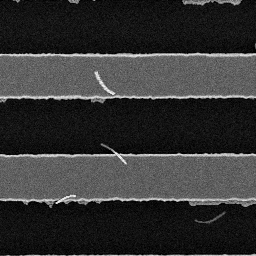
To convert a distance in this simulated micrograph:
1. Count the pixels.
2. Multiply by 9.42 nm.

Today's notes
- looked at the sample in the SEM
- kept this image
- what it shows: lines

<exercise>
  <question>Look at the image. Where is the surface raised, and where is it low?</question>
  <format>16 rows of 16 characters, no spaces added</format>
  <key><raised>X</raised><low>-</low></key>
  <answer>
----------------
----------------
----------------
XXXXXXXXXXXXXXXX
XXXXXXXXXXXXXXXX
XXXXXXXXXXXXXXXX
----------------
----------------
----------------
----------------
XXXXXXXXXXXXXXXX
XXXXXXXXXXXXXXXX
XXXXXXXXXXXXXXXX
----------------
----------------
----------------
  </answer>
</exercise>